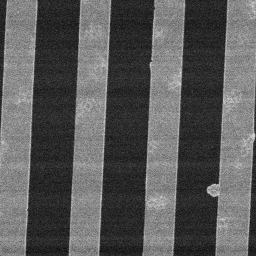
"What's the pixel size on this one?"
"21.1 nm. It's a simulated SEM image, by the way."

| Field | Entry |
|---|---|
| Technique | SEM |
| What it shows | one or a few lines or trenches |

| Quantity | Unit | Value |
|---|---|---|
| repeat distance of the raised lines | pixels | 73.7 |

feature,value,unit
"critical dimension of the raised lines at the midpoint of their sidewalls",627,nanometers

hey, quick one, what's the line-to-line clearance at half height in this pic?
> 931 nm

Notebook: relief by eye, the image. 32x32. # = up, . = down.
.####.....####.....####......###
.####.....####.....####.....####
.####.....####.....####.....####
.###......####.....####.....####
.###......####.....####.....####
.###......####.....####.....####
.###......###......####.....####
.###......###......####.....####
.###......###......####.....####
.###......###......####.....####
####......###......####.....####
####......###......####.....####
####......###......###......####
####......###......###......####
####......###......###......####
####.....####......###......####
####.....####......###......####
####.....####......###......####
####.....####......###......####
####.....####.....####......###.
####.....####.....####......###.
####.....####.....####......###.
####.....####.....####......###.
####.....####.....####....#####.
###......####.....####.....####.
###......####.....####.....####.
###......####.....####.....####.
###......###......####.....####.
###......###......####.....####.
###......###......####.....####.
###......###......####.....####.
###......###......####.....####.